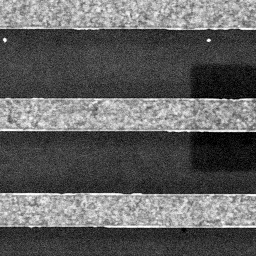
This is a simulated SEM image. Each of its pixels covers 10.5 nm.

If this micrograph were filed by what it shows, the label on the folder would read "lines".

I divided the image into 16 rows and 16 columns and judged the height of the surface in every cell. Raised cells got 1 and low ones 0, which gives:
1111111111111111
1111111111111111
0000000000000000
0000000000000000
0000000000000000
0000000000000000
1111111111111111
1111111111111111
0000000000000000
0000000000000000
0000000000000000
0000000000000000
1111111111111111
1111111111111111
0000000000000000
0000000000000000